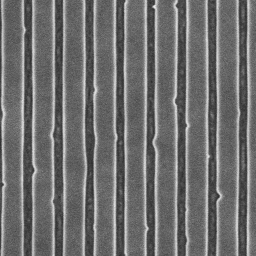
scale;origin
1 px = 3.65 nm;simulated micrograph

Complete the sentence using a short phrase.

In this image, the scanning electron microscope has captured parallel lines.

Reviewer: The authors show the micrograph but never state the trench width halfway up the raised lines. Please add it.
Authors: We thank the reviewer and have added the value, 32.4 nanometres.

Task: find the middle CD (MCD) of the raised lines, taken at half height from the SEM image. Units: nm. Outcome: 77.5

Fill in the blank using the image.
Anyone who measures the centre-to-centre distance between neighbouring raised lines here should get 30.7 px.